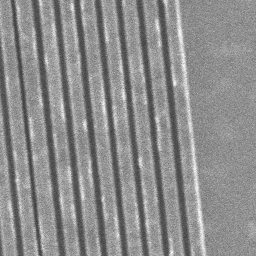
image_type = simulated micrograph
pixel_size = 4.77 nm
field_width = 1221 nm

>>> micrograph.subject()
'parallel lines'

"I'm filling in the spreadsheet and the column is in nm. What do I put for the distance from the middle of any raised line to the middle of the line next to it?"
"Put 99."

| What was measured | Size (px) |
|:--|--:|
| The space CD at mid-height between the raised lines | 6.96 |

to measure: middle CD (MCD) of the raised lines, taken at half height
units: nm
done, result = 66.3